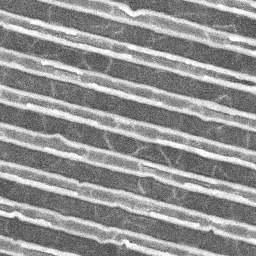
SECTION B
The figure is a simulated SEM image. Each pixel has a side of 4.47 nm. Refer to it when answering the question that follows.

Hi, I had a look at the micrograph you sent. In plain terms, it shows parallel lines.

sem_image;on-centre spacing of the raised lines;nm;162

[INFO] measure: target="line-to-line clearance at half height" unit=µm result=0.0995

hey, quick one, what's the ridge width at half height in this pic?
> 64.9 nm